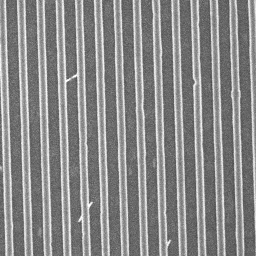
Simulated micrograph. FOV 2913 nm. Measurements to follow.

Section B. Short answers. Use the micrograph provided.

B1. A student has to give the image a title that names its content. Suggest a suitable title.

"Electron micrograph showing parallel lines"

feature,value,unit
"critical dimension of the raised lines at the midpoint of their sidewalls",0.0767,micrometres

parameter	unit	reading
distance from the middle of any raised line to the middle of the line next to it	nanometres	219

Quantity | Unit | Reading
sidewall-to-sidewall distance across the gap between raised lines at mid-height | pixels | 12.6